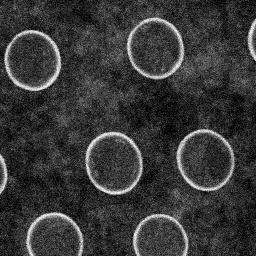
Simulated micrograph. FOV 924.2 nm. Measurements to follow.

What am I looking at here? raised bodies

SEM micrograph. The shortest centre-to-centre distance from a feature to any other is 386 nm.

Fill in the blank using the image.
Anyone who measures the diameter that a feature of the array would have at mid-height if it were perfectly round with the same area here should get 203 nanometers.